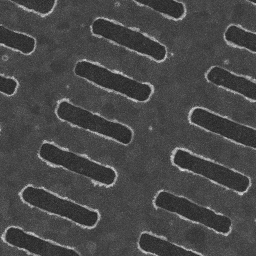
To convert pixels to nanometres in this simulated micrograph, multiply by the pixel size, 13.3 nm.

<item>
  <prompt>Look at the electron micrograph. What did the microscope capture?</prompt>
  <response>holes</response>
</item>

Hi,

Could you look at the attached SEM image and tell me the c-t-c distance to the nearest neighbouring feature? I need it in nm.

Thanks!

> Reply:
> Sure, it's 593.